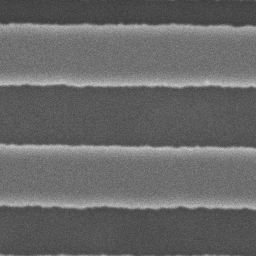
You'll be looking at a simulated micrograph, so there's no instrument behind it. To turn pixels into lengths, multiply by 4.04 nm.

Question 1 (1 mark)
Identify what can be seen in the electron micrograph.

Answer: lines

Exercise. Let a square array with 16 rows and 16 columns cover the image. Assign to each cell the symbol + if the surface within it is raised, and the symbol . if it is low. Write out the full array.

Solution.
................
++..............
++++++++++++++++
++++++++++++++++
++++++++++++++++
................
................
................
................
++++++++++++++++
++++++++++++++++
++++++++++++++++
++++++++++++++++
................
................
................